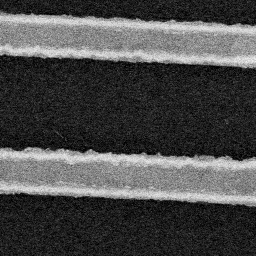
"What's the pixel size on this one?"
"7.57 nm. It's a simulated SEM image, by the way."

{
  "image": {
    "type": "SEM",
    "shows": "one or a few lines or trenches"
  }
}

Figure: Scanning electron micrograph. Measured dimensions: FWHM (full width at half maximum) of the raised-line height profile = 31.7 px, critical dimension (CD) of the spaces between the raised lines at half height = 0.787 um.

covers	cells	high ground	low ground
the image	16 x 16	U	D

DDDDDDDDDDDDDDDD
UUUUUUUDDDDDDDDD
UUUUUUUUUUUUUUUU
DDDDDDDDDUUUUUUU
DDDDDDDDDDDDDDDD
DDDDDDDDDDDDDDDD
DDDDDDDDDDDDDDDD
DDDDDDDDDDDDDDDD
DDDDDDDDDDDDDDDD
DDDDDDDDDDDDDDDD
UUUUUUUUUUUUUUUU
UUUUUUUUUUUUUUUU
DDDDDDDDDDDDDDDD
DDDDDDDDDDDDDDDD
DDDDDDDDDDDDDDDD
DDDDDDDDDDDDDDDD